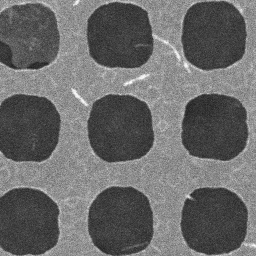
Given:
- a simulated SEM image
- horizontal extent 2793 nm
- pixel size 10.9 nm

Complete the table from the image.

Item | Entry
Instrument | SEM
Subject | holes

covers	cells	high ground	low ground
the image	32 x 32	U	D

UUUDDUUUUUUUUDDDDUUUUUUUDDDDDUUU
DDDDDDDUUUUUDDDDDDUUUUUDDDDDDDUU
DDDDDDDUUUUDDDDDDDDUUUUDDDDDDDDU
DDDDDDDUUUUDDDDDDDDUUUUDDDDDDDDU
DDDDDDDUUUUDDDDDDDDUUUUDDDDDDDDU
DDDDDDDUUUUDDDDDDDDUUUUDDDDDDDDU
DDDDDDDUUUUDDDDDDDDUUUUDDDDDDDDU
DDDDDDDUUUUUDDDDDDDUUUUDDDDDDDUU
UDDDDUUUUUUUUUUDDUUUUUUUUDDDUUUU
UUUUUUUUUUUUUUUUUUUUUUUUUUUUUUUU
UUUUUUUUUUUUUUUUUUUUUUUUUUUUUUUU
UUUUUUUUUUUUUUUUUUUUUUUUUUUUUUUU
DDDDDDUUUUUUDDDDDDUUUUUUDDDDDDUU
DDDDDDDUUUUDDDDDDDDUUUUDDDDDDDDU
DDDDDDDUUUUDDDDDDDDUUUUDDDDDDDDU
DDDDDDDDUUUDDDDDDDDUUUUDDDDDDDDU
DDDDDDDDUUUDDDDDDDDUUUUDDDDDDDDU
DDDDDDDUUUUDDDDDDDDUUUUDDDDDDDDU
DDDDDDDUUUUDDDDDDDDUUUUDDDDDDDDU
UDDDDDUUUUUUDDDDDDUUUUUUDDDDDDUU
UUUUUUUUUUUUUUUUUUUUUUUUUUUUUUUU
UUUUUUUUUUUUUUUUUUUUUUUUUUUUUUUU
UUUUUUUUUUUUUUUUUUUUUUUUUUUUUUUU
UUDDUUUUUUUUUDDDDUUUUUUUUDDDUUUU
DDDDDDUUUUUUDDDDDDUUUUUUDDDDDDUU
DDDDDDDUUUUDDDDDDDDUUUUDDDDDDDDU
DDDDDDDUUUUDDDDDDDDUUUUDDDDDDDDU
DDDDDDDUUUUDDDDDDDDUUUUDDDDDDDDU
DDDDDDDUUUUDDDDDDDDUUUUDDDDDDDDU
DDDDDDDUUUUDDDDDDDDUUUUDDDDDDDDU
DDDDDDDUUUUUDDDDDDDUUUUDDDDDDDUU
UDDDDDUUUUUUUDDDDUUUUUUUUDDDDUUU